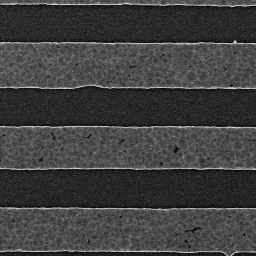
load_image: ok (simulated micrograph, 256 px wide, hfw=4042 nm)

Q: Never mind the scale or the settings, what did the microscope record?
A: one or a few lines or trenches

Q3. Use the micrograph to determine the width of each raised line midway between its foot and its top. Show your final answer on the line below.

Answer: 640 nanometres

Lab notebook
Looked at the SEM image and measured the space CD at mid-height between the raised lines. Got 610 nanometres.